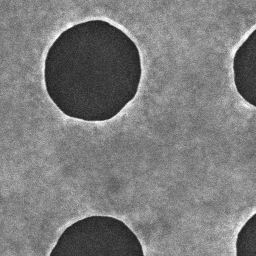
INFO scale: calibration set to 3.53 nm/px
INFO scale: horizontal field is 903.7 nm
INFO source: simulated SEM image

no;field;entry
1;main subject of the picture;holes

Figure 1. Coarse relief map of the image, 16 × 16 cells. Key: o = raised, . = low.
oooooooooooooooo
ooooo..ooooooooo
ooo.....ooooooo.
ooo......oooooo.
ooo......oooooo.
ooo......oooooo.
ooo.....oooooooo
ooooo..ooooooooo
oooooooooooooooo
oooooooooooooooo
oooooooooooooooo
oooooooooooooooo
oooooooooooooooo
oooooo.ooooooooo
oooo....ooooooo.
ooo......oooooo.